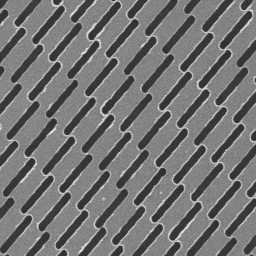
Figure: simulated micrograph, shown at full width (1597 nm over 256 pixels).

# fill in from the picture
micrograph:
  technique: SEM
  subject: a regular array of holes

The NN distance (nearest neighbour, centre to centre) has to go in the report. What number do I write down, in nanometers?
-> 154